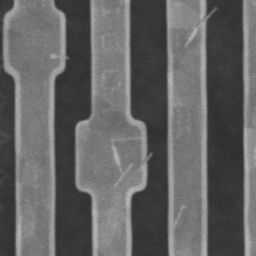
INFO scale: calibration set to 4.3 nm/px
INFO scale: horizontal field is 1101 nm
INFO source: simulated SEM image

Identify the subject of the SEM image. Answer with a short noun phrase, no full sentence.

wiring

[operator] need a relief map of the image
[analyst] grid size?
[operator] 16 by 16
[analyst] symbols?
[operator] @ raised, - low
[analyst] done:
-@@---@@---@@--@
@@@@--@@---@@--@
@@@@--@@---@@--@
@@@@--@@---@@--@
-@@@--@@---@@--@
-@@---@@---@@--@
-@@---@@---@@--@
-@@---@@---@@--@
-@@--@@@@--@@--@
-@@--@@@@--@@--@
-@@--@@@@--@@--@
-@@--@@@@--@@--@
-@@---@@---@@--@
-@@---@@---@@--@
-@@---@@---@@--@
-@@---@@---@@--@